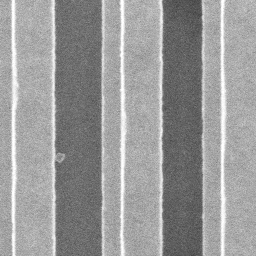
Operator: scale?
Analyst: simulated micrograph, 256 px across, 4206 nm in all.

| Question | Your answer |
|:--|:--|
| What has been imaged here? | lines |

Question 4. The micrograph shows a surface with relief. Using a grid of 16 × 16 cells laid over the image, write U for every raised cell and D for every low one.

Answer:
UUUDDDUUUUDDDUUU
UUUDDDUUUUDDDUUU
UUUDDDUUUUDDDUUU
UUUDDDUUUUDDDUUU
UUUDDDUUUUDDDUUU
UUUDDDUUUUDDDUUU
UUUDDDUUUUDDDUUU
UUUDDDUUUUDDDUUU
UUUDDDUUUUDDDUUU
UUUDDDUUUUDDDUUU
UUUDDDUUUUDDDUUU
UUUDDDUUUUDDDUUU
UUUDDDUUUUDDDUUU
UUUDDDUUUUDDDUUU
UUUDDDUUUUDDDUUU
UUUDDDUUUUDDDUUU